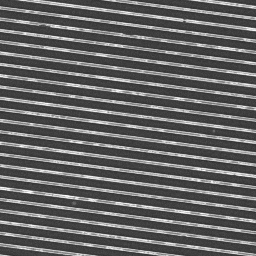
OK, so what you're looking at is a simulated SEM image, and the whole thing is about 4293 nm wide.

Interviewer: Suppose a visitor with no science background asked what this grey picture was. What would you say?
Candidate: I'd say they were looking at parallel lines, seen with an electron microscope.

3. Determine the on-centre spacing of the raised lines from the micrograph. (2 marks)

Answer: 188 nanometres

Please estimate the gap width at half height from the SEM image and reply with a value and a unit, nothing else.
152 nm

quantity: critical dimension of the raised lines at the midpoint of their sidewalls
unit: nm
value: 41.6